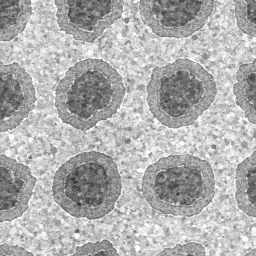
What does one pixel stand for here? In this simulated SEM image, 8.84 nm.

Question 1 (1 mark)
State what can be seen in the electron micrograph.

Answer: ring-shaped grooves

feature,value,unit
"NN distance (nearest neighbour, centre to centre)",0.805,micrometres